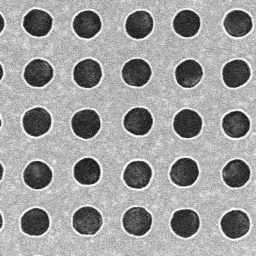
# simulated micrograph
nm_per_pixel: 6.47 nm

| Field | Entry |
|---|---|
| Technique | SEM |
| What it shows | a regular array of holes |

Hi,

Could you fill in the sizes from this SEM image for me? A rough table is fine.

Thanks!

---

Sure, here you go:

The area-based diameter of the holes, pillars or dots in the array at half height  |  189 nm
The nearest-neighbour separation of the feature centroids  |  313 nm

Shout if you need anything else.